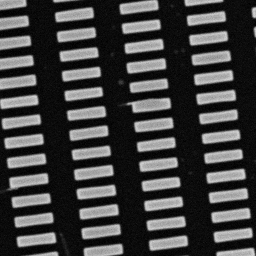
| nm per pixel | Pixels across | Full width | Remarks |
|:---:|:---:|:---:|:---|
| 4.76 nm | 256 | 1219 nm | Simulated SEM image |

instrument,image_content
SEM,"groups of lines, slits or small figures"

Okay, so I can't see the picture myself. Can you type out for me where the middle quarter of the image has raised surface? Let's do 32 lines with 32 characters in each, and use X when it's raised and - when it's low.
----------------XXXXXXXXX-------
----XXXXX-------XXXXXXX---------
XXXXXXXXX-----------------------
XXXXXX--------------------------
-------------------XXXXXXX------
-----------------XXXXXXXXX------
-----XXXX--------XXXXX----------
XXXXXXXXX-----------------------
XXXXXX--------------------------
------------------XXXXXXXXX-----
-----------------XXXXXXXXXX-----
----XXXXXX-------XXXXXX---------
-XXXXXXXXX----------------------
-XXXXX--------------------------
--------------------XXXXXXX-----
------------------XXXXXXXXX-----
----XXXXXXX-------XXXX----------
--XXXXXXXXX---------------------
--XXXX--------------------------
--------------------XXXXXXXX----
-------------------XXXXXXXX-----
---XXXXXXXX--------XX-----------
--XXXXXXXXX---------------------
---XX---------------------------
--------------------XXXXXXXX----
-------------------XXXXXXXXX----
---XXXXXXXXX-------XXX----------
---XXXXXXXXX--------------------
---XXX---------------------XX---
--------------------XXXXXXXXX---
--------------------XXXXXXXXX---
---XXXXXXXXXX-------X-----------